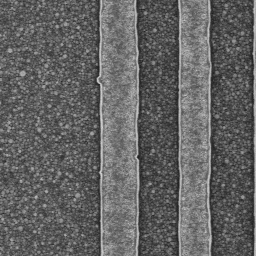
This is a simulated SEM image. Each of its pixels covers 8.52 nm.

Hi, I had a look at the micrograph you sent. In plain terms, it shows one or a few lines or trenches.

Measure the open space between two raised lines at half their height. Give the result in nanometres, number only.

381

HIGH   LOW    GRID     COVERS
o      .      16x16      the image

......oo...oo...
......oo...oo...
......oo...oo...
......ooo..oo...
......ooo..oo...
......ooo..oo...
......ooo..oo...
......ooo..oo...
......ooo..oo...
......ooo..oo...
......ooo..oo...
......ooo..oo...
......ooo..oo...
......ooo..oo...
......ooo..oo...
......ooo..oo...